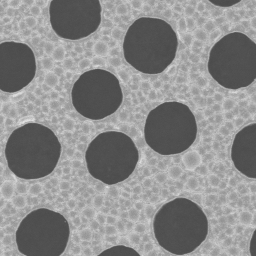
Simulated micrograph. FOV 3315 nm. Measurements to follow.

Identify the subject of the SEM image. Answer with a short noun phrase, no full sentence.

holes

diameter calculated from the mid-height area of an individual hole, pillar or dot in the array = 705 nm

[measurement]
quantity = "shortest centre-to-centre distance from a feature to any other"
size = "0.892 microns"